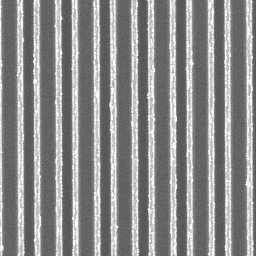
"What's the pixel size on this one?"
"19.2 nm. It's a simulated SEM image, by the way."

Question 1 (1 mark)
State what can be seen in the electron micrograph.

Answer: parallel lines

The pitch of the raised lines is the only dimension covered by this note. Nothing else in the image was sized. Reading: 19.1 pixels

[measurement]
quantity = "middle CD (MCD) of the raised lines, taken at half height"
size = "7.5 pixels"